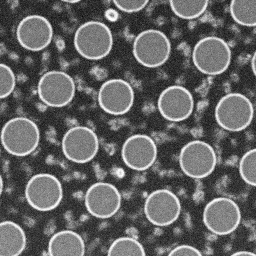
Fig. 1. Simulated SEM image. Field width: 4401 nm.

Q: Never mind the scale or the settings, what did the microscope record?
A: a regular array of raised bodies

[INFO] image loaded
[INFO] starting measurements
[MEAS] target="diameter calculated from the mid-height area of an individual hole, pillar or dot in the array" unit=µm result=0.601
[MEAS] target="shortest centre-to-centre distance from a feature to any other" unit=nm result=1020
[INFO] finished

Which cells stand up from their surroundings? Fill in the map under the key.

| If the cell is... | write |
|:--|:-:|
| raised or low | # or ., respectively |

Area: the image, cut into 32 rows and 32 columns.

...............###...#####...###
......................###....###
...###........................##
..####....###...................
..####...#####...###............
...###...#####...####....###....
..........###....####...#####...
.................####...#####...
#........................###....
##....##........................
##...####....###................
#....####....###.....##.........
.....####...#####...####....###.
.............###....####...####.
.....................##....####.
.###........................###.
#####....##.....................
#####...####....###.............
.###....####...####....###......
........####...####....####....#
................###....####...##
.......................###....##
....###........................#
...#####...###..................
...#####...####....###..........
....###....####...####....###...
...........###....####....####..
...................###....####..
##........................###...
###....###......................
###...####....###...............
##....####....####....###.......